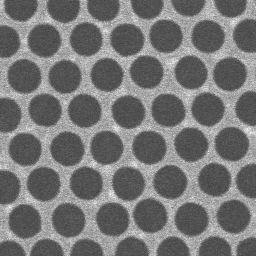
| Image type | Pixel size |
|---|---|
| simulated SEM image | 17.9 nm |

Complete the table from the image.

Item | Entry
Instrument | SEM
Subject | a regular array of holes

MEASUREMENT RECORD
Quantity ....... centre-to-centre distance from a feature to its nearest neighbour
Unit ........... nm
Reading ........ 701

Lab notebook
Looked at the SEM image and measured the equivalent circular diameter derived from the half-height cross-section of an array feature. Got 618 nm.